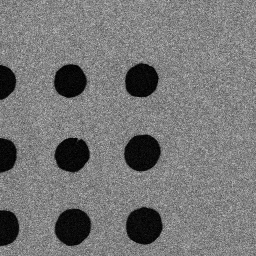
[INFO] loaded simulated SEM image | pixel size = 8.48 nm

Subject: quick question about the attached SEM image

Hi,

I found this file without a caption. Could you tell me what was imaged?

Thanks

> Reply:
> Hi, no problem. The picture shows holes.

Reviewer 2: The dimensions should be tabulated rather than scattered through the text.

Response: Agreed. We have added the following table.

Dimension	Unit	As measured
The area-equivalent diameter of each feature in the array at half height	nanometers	297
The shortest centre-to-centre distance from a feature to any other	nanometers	604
